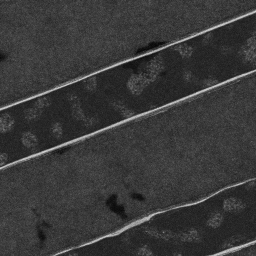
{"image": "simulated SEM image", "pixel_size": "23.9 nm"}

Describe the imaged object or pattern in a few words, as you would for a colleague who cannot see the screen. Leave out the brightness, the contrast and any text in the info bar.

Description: one or a few lines or trenches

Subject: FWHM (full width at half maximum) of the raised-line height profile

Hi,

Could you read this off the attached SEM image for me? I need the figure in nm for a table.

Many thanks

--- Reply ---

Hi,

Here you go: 1310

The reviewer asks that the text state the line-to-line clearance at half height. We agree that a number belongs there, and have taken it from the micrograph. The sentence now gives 100 px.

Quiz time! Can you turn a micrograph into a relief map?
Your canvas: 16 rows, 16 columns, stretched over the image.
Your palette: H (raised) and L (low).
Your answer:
LLLLLLLLLLLLLLLL
LLLLLLLLLLLLLLHH
LLLLLLLLLLLLHHHH
LLLLLLLLLHHHHHHH
LLLLLLHHHHHHHHHH
LLLLHHHHHHHHHLLL
LHHHHHHHHHHLLLLL
HHHHHHHHLLLLLLLL
HHHHHLLLLLLLLLLL
HHHLLLLLLLLLLLLL
LLLLLLLLLLLLLLLL
LLLLLLLLLLLLLLLH
LLLLLLLLLLLLLHHH
LLLLLLLLLHHHHHHH
LLLLLLLHHHHHHHHH
LLLLLHHHHHHHHHHL